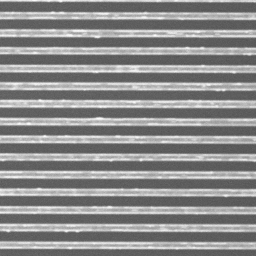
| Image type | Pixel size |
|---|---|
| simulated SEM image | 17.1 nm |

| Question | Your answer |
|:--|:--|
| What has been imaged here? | parallel lines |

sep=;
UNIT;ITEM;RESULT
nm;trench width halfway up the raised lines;183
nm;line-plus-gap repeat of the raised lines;301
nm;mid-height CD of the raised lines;107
